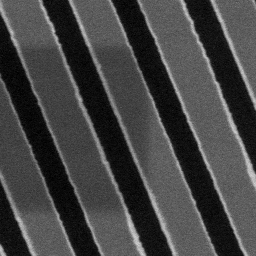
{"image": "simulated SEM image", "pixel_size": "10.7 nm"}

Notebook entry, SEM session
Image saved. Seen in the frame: lines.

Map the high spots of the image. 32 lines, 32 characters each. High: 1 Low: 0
11111000011111000111111000011111
11111100011111100011111000011111
11111100001111100011111100011111
01111110001111100001111100001111
01111110001111110001111110001111
00111110000111110000111110000111
00111111000111111000111111000111
00111111000011111000111111000111
00011111100011111000011111000011
00011111100011111100011111100011
00001111100001111100001111100001
10001111110001111110001111110001
10000111110000111110001111110000
11000111110000111110000111110000
11000111111000011111000111111000
11100011111000011111000011111000
11100011111100011111100011111100
11100001111100001111100001111100
11110001111110001111110001111110
11110001111110000111110001111110
11111000111110000111110000111110
11111000111111000111111000111111
11111100011111000011111000011111
11111100011111100011111100011111
01111100001111100001111100011111
01111110001111110001111100001111
00111110001111110001111110001111
00111111000111110000111110000111
00011111000111111000111111000111
00011111000011111000011111000111
00011111100011111000011111100011
00001111100011111100011111100011